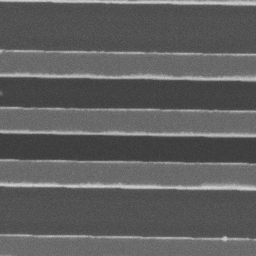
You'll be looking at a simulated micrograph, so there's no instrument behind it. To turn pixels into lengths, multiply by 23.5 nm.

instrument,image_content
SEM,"lines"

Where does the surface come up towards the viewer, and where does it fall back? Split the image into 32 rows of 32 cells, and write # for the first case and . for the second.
..............................##
................................
................................
................................
................................
................................
#############...................
################################
################################
################################
................................
................................
................................
###.............................
################################
################################
################################
................................
................................
................................
###############################.
################################
################################
................################
................................
................................
................................
................................
................................
####............................
################################
################################